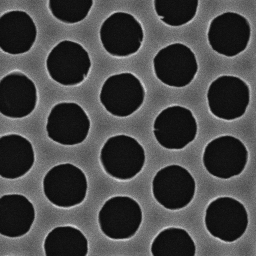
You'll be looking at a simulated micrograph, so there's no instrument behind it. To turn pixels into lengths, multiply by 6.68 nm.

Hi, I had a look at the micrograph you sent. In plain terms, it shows a regular array of holes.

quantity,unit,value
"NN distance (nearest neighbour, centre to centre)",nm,402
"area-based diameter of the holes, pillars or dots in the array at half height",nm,292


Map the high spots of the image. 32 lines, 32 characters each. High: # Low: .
######.....########......#######
#..###.....#########....########
....###...###....###....###....#
....#########.....########.....#
.....########.....########.....#
....###...###.....####.###.....#
#..###.....###...###....###...##
######.....########......#######
######.....########......#######
#..###.....###...###....####.###
....####..###.....###...##.....#
.....########.....########.....#
.....########.....########.....#
....###...###....####..###.....#
#..###.....###..####....###...##
######.....########......#######
######.....########......#######
...####...###....###....###...##
....#########.....###..###.....#
....#########.....#######......#
....####.####.....#######......#
...###....###....###....##....##
#####......########.....########
#####......########.....########
...###.....########.....########
....###...###....###....##....##
....########......########.....#
....########......########.....#
....###..####....####.####.....#
#..###.....##....###....###...##
######.....########.....########
######.....########.....########